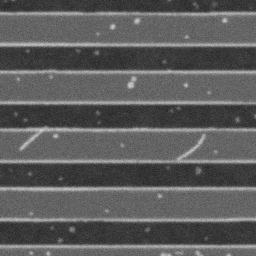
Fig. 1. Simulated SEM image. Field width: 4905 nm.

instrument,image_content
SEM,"lines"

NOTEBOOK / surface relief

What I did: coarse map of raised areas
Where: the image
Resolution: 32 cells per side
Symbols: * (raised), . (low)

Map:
................................
................................
********************************
********************************
********************************
********************************
................................
................................
................................
********************************
********************************
********************************
********************************
................................
................................
................................
********************************
********************************
********************************
********************************
................................
................................
................................
.............*..........**......
********************************
********************************
********************************
********************************
................................
................................
................................
********************************